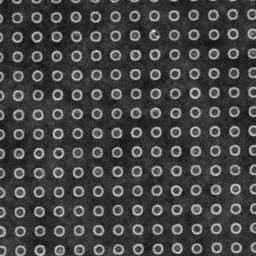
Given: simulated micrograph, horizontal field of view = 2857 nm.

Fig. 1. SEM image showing a regular array of raised bodies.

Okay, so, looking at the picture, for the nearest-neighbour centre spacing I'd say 0.214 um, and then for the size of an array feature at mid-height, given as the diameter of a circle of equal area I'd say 105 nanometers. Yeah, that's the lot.